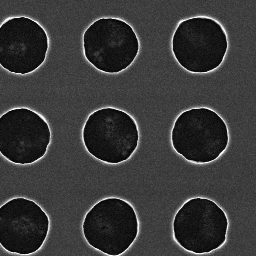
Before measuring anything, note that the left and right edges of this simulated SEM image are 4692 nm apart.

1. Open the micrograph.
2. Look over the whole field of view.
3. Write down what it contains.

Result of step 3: holes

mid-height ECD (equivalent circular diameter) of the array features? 1000 nm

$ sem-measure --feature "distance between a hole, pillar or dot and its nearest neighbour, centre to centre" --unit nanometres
1640